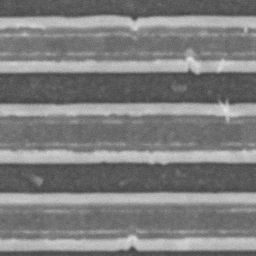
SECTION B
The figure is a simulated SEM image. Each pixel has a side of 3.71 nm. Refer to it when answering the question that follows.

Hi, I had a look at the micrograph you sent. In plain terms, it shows one or a few lines or trenches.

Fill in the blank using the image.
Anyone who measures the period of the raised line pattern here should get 329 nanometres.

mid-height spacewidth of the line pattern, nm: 156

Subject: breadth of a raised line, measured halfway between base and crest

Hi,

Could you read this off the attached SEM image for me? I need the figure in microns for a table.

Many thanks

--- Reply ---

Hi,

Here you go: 0.175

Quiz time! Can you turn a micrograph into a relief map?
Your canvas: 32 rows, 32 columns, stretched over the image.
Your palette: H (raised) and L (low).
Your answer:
LLLLLLLLLLLLLLLLLLLLLLLLLLLLLLLL
LLLLLLLLLLLLLLLLLLLLLLLLLLLLLLLL
LLLLLLLLLLLLLLLLLLLLLLLLLLLLLLLL
HHHHHHHHHHHHHHHHHHHHHHHHHHHHHHHH
HHHHHHHHHHHHHHHHHHHHHHHHHHHHHHHH
HHHHHHHHHHHHHHHHHHHHHHHHHHHHHHHH
HHHHHHHHHHHHHHHHHHHHHHHHHHHHHHHH
HHHHHHHHHHHHHHHHHHHHHHHHHHHHHHHH
LLLLLLLLLLLLLLLLLLLLLLLLLLLLLLLL
LLLLLLLLLLLLLLLLLLLLLLLLLLLLLLLL
LLLLLLLLLLLLLLLLLLLLLLLLLLLLLLLL
LLLLLLLLLLLLLLLLLLLLLLLLLLLLLLLL
LLLLLLLLLLLLLLLLLLLLLLLLLLLLLLLL
LLLLLLLLLLLLLLLLLLLLLLLLLLLLLLLL
HHHHHHHHHHHHHHHHHHHHHHHHHHHHHHHH
HHHHHHHHHHHHHHHHHHHHHHHHHHHHHHHH
HHHHHHHHHHHHHHHHHHHHHHHHHHHHHHHH
HHHHHHHHHHHHHHHHHHHHHHHHHHHHHHHH
HHHHHHHHHHHHHHHHHHHHHHHHHHHHHHHH
HHHHHHHHHHHHHHHHHHHHHHHHHHHHHHHH
LLLLLLLLLLLLLLLLLLLLLLLLLLLLLLLL
LLLLLLLLLLLLLLLLLLLLLLLLLLLLLLLL
LLLLLLLLLLLLLLLLLLLLLLLLLLLLLLLL
LLLLLLLLLLLLLLLLLLLLLLLLLLLLLLLL
LLLLLLLLLLLLLLLLLLLLLLLLLLLLLLLL
HHHHHHHHHHHHHHHHHHHHHHHHHHHHHHHH
HHHHHHHHHHHHHHHHHHHHHHHHHHHHHHHH
HHHHHHHHHHHHHHHHHHHHHHHHHHHHHHHH
HHHHHHHHHHHHHHHHHHHHHHHHHHHHHHHH
HHHHHHHHHHHHHHHHHHHHHHHHHHHHHHHH
HHHHHHHHHHHHHHHHLHHHHHHHHHHHHHHH
LLLLLLLLLLLLLLLLLLLLLLLLLLLLLLLL